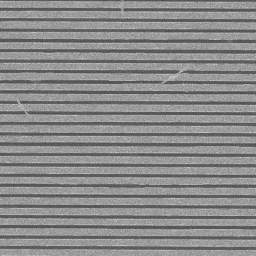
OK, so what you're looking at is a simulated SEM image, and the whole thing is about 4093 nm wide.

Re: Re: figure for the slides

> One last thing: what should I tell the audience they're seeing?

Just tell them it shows parallel lines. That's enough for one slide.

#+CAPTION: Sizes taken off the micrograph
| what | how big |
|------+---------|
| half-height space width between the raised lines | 56 nanometers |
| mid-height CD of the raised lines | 112 nm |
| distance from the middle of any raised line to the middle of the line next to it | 165 nanometres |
